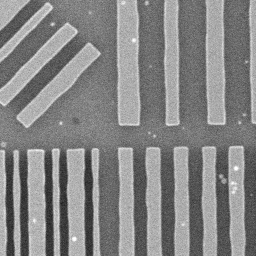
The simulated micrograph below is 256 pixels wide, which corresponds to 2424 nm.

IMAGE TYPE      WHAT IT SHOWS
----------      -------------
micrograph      groups of lines, slits or small figures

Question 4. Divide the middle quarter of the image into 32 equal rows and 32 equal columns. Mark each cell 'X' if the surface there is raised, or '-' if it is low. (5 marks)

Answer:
XXXXXX--------XXXX-------XXX----
XXXXX---------XXXX-------XXX----
XXXX----------XXXX-------XXX----
XXX-----------XXXX-------XXX----
XX------------XXXX-------XXX----
XX------------XXXX-------XXX----
X-------------XXXX--------XX----
--------------XXXXX-------XX----
--------------XXXXX-------XX----
--------------XXXXX-------XX----
--------------XXXXX-------XX----
--------------XXXXX-------XX----
--------------XXXXX-------XX----
--------------XXXXX-------XXX---
--------------XXXXX-------XXX---
--------------------------------
--------------------------------
--------------------------------
--------------------------------
--------------------------------
--------------------------------
---XX--X------XXX----XXX----XXX-
-XXXX--XX-----XXX----XXX----XXX-
-XXXX--XX-----XXX----XXX----XXX-
-XXXX--XX-----XXX---XXXX----XXX-
-XXXX--XX-----XXX---XXXX----XXX-
-XXXX--XX-----XXX----XXX----XXX-
-XXXX--XX-----XXX----XXX----XXX-
-XXXX--X------XXX----XXX----XXX-
-XXXX--X------XXX----XXX----XXX-
-XXXX--XX-----XXX----XXX----XXX-
-XXXX--XX-----XXX----XXX----XXX-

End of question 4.